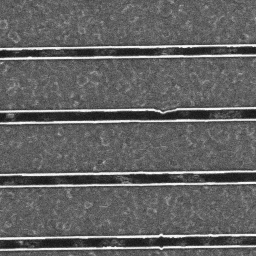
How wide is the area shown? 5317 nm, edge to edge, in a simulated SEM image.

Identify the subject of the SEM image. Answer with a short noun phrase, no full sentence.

one or a few lines or trenches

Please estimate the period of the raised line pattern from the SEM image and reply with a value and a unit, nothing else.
63.4 pixels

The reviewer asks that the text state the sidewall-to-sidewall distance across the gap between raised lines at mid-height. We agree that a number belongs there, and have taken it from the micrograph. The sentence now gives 1050 nm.